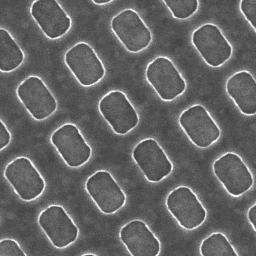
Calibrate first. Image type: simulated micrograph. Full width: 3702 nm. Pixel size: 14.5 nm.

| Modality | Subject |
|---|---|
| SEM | a regular array of holes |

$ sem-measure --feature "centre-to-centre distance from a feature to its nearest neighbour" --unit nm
832